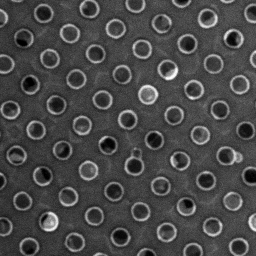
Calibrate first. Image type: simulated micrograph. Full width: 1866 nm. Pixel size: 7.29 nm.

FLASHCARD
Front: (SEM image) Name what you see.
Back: a regular array of raised bodies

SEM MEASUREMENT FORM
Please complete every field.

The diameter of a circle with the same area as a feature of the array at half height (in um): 0.13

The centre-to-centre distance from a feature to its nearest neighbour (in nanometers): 234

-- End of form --